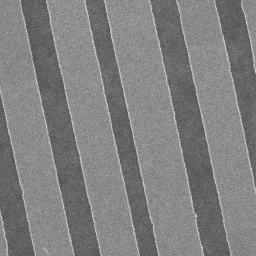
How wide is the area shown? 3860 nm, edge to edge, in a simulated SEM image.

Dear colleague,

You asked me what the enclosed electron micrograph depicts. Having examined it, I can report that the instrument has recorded one or a few lines or trenches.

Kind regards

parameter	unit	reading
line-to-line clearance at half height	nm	385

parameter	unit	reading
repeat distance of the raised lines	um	0.955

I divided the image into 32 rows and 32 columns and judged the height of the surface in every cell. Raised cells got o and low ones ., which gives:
ooo...ooooo..oooooo...ooooo...oo
ooo...ooooo..oooooo...ooooo...oo
ooo...ooooo...ooooo....oooo....o
ooo...ooooo...ooooo....ooooo...o
ooo....ooooo..oooooo...ooooo...o
oooo...ooooo..oooooo...ooooo...o
oooo...ooooo..oooooo....oooo....
oooo...ooooo...ooooo....ooooo...
oooo....oooo...oooooo...ooooo...
oooo....ooooo..oooooo...ooooo...
ooooo...ooooo..oooooo...ooooo...
ooooo...ooooo..oooooo....oooo...
ooooo...ooooo...ooooo....ooooo..
.oooo....oooo...oooooo...ooooo..
.ooooo...ooooo..oooooo...ooooo..
.ooooo...ooooo..oooooo...ooooo..
.ooooo...ooooo...ooooo....oooo..
.ooooo...ooooo...ooooo....ooooo.
..oooo....ooooo..oooooo...ooooo.
..ooooo...ooooo..oooooo...ooooo.
..ooooo...ooooo..oooooo...ooooo.
..ooooo...ooooo...ooooo....oooo.
..ooooo....oooo...ooooo....ooooo
...oooo....ooooo..oooooo...ooooo
...ooooo...ooooo..oooooo...ooooo
...ooooo...ooooo..oooooo....oooo
...ooooo...ooooo...ooooo....oooo
...ooooo....oooo...oooooo...oooo
....ooooo...ooooo..oooooo...oooo
o...ooooo...ooooo..oooooo...oooo
o...ooooo...ooooo...ooooo....ooo
o...ooooo....oooo...ooooo....ooo